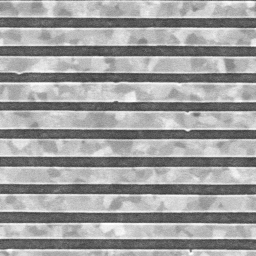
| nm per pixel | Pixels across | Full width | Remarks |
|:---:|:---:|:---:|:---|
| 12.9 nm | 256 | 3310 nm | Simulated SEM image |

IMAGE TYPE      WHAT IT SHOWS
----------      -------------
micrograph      parallel lines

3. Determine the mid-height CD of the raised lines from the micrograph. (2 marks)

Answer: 213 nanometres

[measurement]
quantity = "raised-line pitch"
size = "0.359 µm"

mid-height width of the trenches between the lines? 139 nm